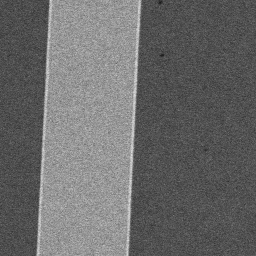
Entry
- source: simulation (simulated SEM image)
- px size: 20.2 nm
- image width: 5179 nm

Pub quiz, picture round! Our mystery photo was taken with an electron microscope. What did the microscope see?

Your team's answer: one or a few lines or trenches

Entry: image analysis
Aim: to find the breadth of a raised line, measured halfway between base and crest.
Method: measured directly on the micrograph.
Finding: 1800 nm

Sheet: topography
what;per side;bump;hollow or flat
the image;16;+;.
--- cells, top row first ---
...++++++.......
...++++++.......
...++++++.......
...++++++.......
...++++++.......
...+++++........
...+++++........
...+++++........
...+++++........
...+++++........
...+++++........
...+++++........
...+++++........
..++++++........
..++++++........
..++++++........